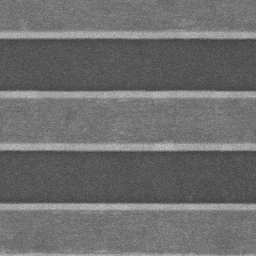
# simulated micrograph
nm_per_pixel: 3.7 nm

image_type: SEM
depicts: one or a few lines or trenches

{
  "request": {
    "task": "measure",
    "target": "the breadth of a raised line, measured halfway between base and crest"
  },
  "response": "0.193 microns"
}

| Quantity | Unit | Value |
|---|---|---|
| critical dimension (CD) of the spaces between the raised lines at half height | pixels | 60.1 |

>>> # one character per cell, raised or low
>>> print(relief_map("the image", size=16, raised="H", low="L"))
HHHHHHHHHHHHHHHH
HHHHHHHHHHHHHHHH
LLLLLLLLLLLLLLLL
LLLLLLLLLLLLLLLL
LLLLLLLLLLLLLLLL
LLLLLLLLLLLLLLLL
HHHHHHHHHHHHHHHH
HHHHHHHHHHHHHHHH
HHHHHHHHHHHHHHHH
LLLLLLLLLLLLLLLL
LLLLLLLLLLLLLLLL
LLLLLLLLLLLLLLLL
LLLLLLLLLLLLLLLL
HHHHHHHHHHHHHHHH
HHHHHHHHHHHHHHHH
HHHHHHHHHHHHHHHH